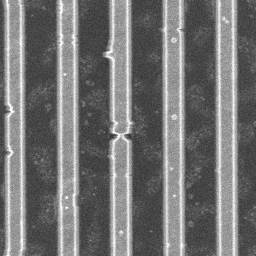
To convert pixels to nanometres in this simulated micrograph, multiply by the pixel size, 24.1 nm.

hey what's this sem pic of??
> parallel lines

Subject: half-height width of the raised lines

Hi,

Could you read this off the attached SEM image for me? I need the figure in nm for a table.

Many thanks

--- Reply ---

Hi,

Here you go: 394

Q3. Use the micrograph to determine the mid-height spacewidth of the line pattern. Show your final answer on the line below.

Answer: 873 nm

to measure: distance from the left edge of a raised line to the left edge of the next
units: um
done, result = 1.27